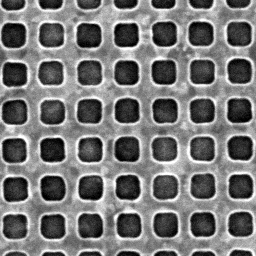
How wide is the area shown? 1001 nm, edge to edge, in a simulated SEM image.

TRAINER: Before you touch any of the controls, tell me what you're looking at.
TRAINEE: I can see a regular array of holes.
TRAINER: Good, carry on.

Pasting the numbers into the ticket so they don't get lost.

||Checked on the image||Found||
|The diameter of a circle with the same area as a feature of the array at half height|111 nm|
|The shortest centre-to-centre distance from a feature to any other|146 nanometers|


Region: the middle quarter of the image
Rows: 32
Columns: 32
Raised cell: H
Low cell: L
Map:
HHHLLLLLLLHHHLLLLLLHHHLLLLLLHHHL
HHHLLLLLLLHHLLLLLLLHHHLLLLLLHHHL
HHHLLLLLLLHHLLLLLLLHHHLLLLLLHHHL
HHHLLLLLLLHHLLLLLLLHHHLLLLLLHHHL
HHHHLLLLLLHHHLLLLLLHHHLLLLLLHHHH
HHHHHLLLHHHHHHLLLHHHHHHHHHHHHHHH
HHHHHHHHHHHHHHHHHHHHHHHHHHHHHHHH
HHHHHHHHHHHHHHHHHHHHHHHHHHHHHHHH
HHHHHLLLHHHHHHLLLLHHHHHHLLLHHHHH
HHHLLLLLLHHHHLLLLLLHHHLLLLLLHHHH
HHHLLLLLLLHHLLLLLLLHHHLLLLLLLHHL
HHHLLLLLLLHHLLLLLLLHHHLLLLLLLHHL
HHHLLLLLLLHHLLLLLLLHHHLLLLLLLHHL
HHHLLLLLLLHHHLLLLLLHHHLLLLLLHHHL
HHHHLLLLLHHHHLLLLLLHHHHLLLLLHHHH
HHHHHHHHHHHHHHHHHHHHHHHHHHHHHHHH
HHHHHHHHHHHHHHHHHHHHHHHHHHHHHHHH
HHHHHHHHHHHHHHHHHHHHHHHHHHHHHHHH
HHHHLLLLLHHHHLLLLLHHHHLLLLLLHHHH
HHHLLLLLLLHHHLLLLLLHHHLLLLLLHHHL
LHHLLLLLLLHHLLLLLLLHHHLLLLLLLHHL
LHHLLLLLLLHHLLLLLLLHHHLLLLLLLHHL
LHHLLLLLLLHHLLLLLLLHHHLLLLLLLHHL
LHHLLLLLLLHHHLLLLLLHHHLLLLLLHHHH
HHHHLLLLLHHHHHHHLLHHHHHHLLLHHHHH
HHHHHHHHHHHHHHHHHHHHHHHHHHHHHHHH
HHHHHHHHHHHHHHHHHHHHHHHHHHHHHHHH
HHHHHHLLHHHHHHHHHHHHHHHHHHLHHHHH
HHHHLLLLLLHHHLLLLLLHHHLLLLLLHHHH
HHHHLLLLLLHHHLLLLLLHHHLLLLLLLHHH
LHHLLLLLLLHHHLLLLLLHHHLLLLLLLHHL
LHHLLLLLLLHHHLLLLLLHHHLLLLLLLHHL